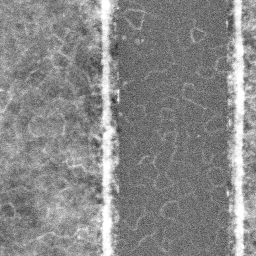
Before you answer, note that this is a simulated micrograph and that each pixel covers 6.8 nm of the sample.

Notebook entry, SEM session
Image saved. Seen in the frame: one or a few lines or trenches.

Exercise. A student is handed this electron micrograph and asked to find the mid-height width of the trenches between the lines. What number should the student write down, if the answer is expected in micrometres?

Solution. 0.905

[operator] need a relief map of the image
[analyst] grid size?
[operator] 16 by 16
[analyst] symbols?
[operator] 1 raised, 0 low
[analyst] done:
1111111000000001
1111111000000001
1111111000000001
1111111000000001
1111111000000001
1111111000000001
1111111000000001
1111111000000001
1111111000000001
1111111000000001
1111111000000001
1111111000000001
1111111000000001
1111111000000001
1111111000000001
1111111000000001